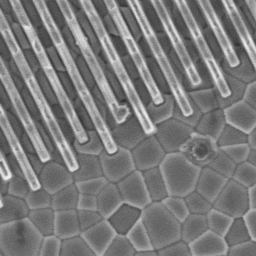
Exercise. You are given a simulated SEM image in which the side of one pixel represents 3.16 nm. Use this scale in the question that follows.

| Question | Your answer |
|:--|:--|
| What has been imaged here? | parallel lines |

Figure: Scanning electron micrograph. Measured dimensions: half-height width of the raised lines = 29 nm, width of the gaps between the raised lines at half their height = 37.2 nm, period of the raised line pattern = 66.9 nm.